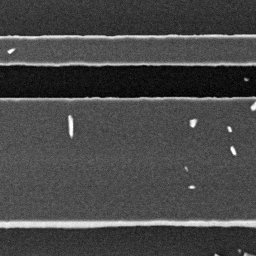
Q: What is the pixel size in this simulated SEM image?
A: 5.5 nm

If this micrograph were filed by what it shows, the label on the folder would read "lines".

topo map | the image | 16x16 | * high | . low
................
................
****************
****************
................
................
****************
****************
****************
****************
****************
****************
****************
****************
................
................